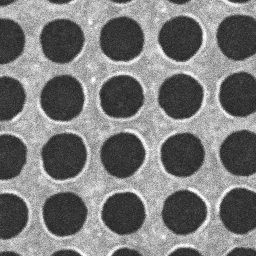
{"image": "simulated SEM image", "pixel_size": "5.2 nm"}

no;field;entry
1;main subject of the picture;a regular array of holes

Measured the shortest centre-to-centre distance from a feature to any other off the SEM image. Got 299 nm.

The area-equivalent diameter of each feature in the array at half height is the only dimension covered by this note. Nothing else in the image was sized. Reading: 238 nm